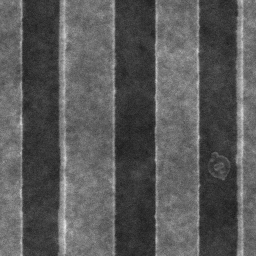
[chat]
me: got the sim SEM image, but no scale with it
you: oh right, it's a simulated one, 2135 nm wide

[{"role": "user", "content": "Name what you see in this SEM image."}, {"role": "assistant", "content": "lines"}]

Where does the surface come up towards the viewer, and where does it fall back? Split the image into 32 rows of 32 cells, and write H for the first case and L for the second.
HHHLLLLLHHHHHHLLLLLLHHHHHLLLLLHH
HHHLLLLLHHHHHHLLLLLLHHHHHLLLLLHH
HHHLLLLLHHHHHHLLLLLLHHHHHLLLLLHH
HHHLLLLLHHHHHHLLLLLLHHHHHLLLLLHH
HHHLLLLLHHHHHHLLLLLLHHHHHLLLLLHH
HHHLLLLLHHHHHHLLLLLLHHHHHLLLLLHH
HHHLLLLLHHHHHHLLLLLLHHHHHLLLLLHH
HHHLLLLLHHHHHHLLLLLLHHHHHLLLLLHH
HHHLLLLLHHHHHHLLLLLLHHHHHLLLLLHH
HHHLLLLLHHHHHHLLLLLLHHHHHLLLLLHH
HHHLLLLLHHHHHHLLLLLLHHHHHLLLLLHH
HHHLLLLLHHHHHHLLLLLLHHHHHLLLLLHH
HHHLLLLLHHHHHHLLLLLLHHHHHLLLLLHH
HHHLLLLLHHHHHHLLLLLLHHHHHLLLLLHH
HHHLLLLLHHHHHHLLLLLLHHHHHLLLLLHH
HHHLLLLLHHHHHHLLLLLLHHHHHLLLLLHH
HHHLLLLLHHHHHHLLLLLLHHHHHLLLLLHH
HHHLLLLLHHHHHHLLLLLLHHHHHLLLLLHH
HHHLLLLLHHHHHHLLLLLLHHHHHLLLLLHH
HHHLLLLLHHHHHHLLLLLLHHHHHLLLLLHH
HHHLLLLLHHHHHHLLLLLLHHHHHLLLLLHH
HHHLLLLLHHHHHHLLLLLLHHHHHLLLLLHH
HHHLLLLLHHHHHHLLLLLLHHHHHLLLLLHH
HHHLLLLLHHHHHHLLLLLLHHHHHLLLLLHH
HHHLLLLLHHHHHHLLLLLLHHHHHLLLLLHH
HHHLLLLLHHHHHHLLLLLLHHHHHLLLLLHH
HHHLLLLLHHHHHHLLLLLLHHHHHLLLLLHH
HHHLLLLLHHHHHHLLLLLLHHHHHLLLLLHH
HHHLLLLLHHHHHHLLLLLLHHHHHLLLLLHH
HHHLLLLLHHHHHHLLLLLLHHHHHLLLLLHH
HHHLLLLLHHHHHHLLLLLLHHHHHLLLLLHH
HHHLLLLLHHHHHHLLLLLLHHHHHLLLLLHH